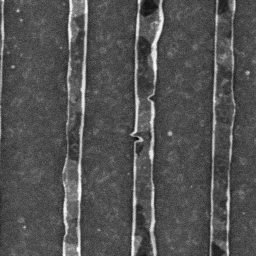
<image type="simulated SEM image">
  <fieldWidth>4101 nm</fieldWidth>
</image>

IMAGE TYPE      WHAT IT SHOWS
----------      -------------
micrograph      one or a few lines or trenches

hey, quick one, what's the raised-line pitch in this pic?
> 1180 nanometers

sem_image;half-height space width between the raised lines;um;0.927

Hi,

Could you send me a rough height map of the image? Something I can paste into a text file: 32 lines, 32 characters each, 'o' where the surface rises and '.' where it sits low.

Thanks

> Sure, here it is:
.........oo......ooo.......oo...
.........oo......ooo.......oo...
.........oo......ooo.......oo...
.........oo......ooo.......oo...
.........oo......ooo.......oo...
.........oo......oo........oo...
.........oo......oo........oo...
.........oo......oo........oo...
.........o.......oo........oo...
........oo.......oo........oo...
........oo.......oo........oo...
.........o.......oo........oo...
.........o.......oo........oo...
.........o.......oo........oo...
.........o.......oo........oo...
........oo.......oo........oo...
........oo.......oo........oo...
........oo.......oo........oo...
.........o.......oo........oo...
........oo.......oo........oo...
........oo.......oo........oo...
........oo.......oo........oo...
........oo.......oo........oo...
........oo.......oo.......ooo...
........oo.......oo.......ooo...
........oo.......oo.......oo....
........oo.......oo.......oo....
........oo.......oo........oo...
........oo.......oo.......ooo...
........oo.......oo.......oo....
........oo.......oo.......oo....
........oo.......oo.......ooo...